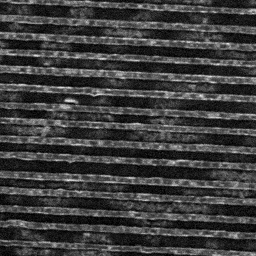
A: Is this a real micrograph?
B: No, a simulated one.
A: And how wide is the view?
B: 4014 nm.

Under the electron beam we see parallel lines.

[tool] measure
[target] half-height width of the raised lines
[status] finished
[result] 0.09 micrometres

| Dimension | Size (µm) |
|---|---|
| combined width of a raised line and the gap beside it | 0.271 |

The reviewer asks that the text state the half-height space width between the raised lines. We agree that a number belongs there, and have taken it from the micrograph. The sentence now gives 182 nm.